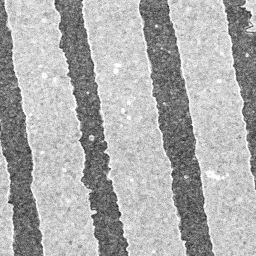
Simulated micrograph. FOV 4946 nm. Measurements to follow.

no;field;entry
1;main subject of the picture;one or a few lines or trenches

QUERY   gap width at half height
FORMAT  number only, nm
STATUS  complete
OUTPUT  540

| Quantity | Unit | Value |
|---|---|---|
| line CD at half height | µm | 1.01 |